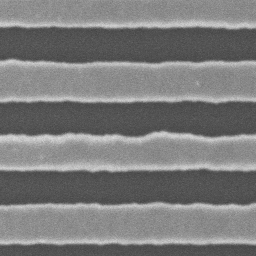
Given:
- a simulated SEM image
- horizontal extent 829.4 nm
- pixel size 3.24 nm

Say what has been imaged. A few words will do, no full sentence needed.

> lines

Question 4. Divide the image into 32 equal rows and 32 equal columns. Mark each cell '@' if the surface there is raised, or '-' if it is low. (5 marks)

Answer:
@@@@@@@@@@@@@@@@@@@@@@@@@@@@@@@@
@@@@@@@@@@@@@@@@@@@@@@@@@@@@@@@@
@@@@@@@@@@@@@@@@@@@@@@@@@@@@@@@@
--------------------------------
--------------------------------
--------------------------------
--------------------------------
--------------------------------
@@@@@@@@@@@@@@@@@@@@@@@@@@@@@@@@
@@@@@@@@@@@@@@@@@@@@@@@@@@@@@@@@
@@@@@@@@@@@@@@@@@@@@@@@@@@@@@@@@
@@@@@@@@@@@@@@@@@@@@@@@@@@@@@@@@
@@@@@@@@-@@@@@@@@@@@@@@--@@@@@@@
--------------------------------
--------------------------------
--------------------------------
--------------------------------
@@@@@@@@@@@@@@@@@@@@@@@@@@@@@@@@
@@@@@@@@@@@@@@@@@@@@@@@@@@@@@@@@
@@@@@@@@@@@@@@@@@@@@@@@@@@@@@@@@
@@@@@@@@@@@@@@@@@@@@@@@@@@@@@@@@
--------------------------------
--------------------------------
--------------------------------
--------------------------------
-----@@---@@----@--@@---@@-----@
@@@@@@@@@@@@@@@@@@@@@@@@@@@@@@@@
@@@@@@@@@@@@@@@@@@@@@@@@@@@@@@@@
@@@@@@@@@@@@@@@@@@@@@@@@@@@@@@@@
@@@@@@@@@@@@@@@@@@@@@@@@@@@@@@@@
@@@@---@----@--@---@----@-------
--------------------------------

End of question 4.